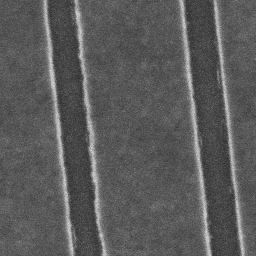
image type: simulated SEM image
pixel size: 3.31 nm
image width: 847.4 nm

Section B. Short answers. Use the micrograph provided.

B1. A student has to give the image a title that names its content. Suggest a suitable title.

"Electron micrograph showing one or a few lines or trenches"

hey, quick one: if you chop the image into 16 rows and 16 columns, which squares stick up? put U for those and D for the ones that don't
UUUDDUUUUUUDDUUU
UUUDDUUUUUUUDDUU
UUUDDUUUUUUUDDUU
UUUDDUUUUUUUDDUU
UUUDDUUUUUUUDDUU
UUUDDUUUUUUUDDUU
UUUDDUUUUUUUDDUU
UUUUDDUUUUUUDDUU
UUUUDDUUUUUUDDUU
UUUUDDUUUUUUDDUU
UUUUDDUUUUUUUDDU
UUUUDDUUUUUUUDDU
UUUUDDUUUUUUUDDU
UUUUDDUUUUUUUDDU
UUUUDDUUUUUUUDDU
UUUUDDUUUUUUUDDU